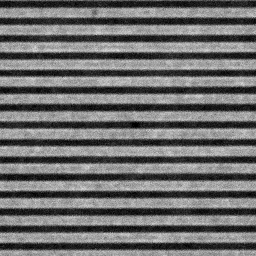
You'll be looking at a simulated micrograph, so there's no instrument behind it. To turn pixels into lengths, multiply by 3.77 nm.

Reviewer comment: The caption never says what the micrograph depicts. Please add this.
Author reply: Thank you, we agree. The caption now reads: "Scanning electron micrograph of parallel lines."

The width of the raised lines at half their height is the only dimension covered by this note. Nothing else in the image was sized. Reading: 34 nanometres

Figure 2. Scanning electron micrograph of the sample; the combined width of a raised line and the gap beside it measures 65.3 nm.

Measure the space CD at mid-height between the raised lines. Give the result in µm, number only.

0.0311